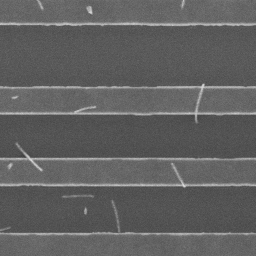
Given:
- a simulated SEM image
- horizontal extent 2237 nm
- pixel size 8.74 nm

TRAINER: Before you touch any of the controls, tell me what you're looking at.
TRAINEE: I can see lines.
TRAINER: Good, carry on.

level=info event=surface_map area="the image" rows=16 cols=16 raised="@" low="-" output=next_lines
@@@@@@@@@@@@@@@@
@@@@@@@@@@@@@@@@
----------------
----------------
----------------
@@@@@@@@@@@@@@@@
@@@@@@@@@@@@@@@@
----------------
----------------
----------------
@@@@@@@@@@@@@@@@
@@@@@@@@@@@@@@@@
----------------
----------------
----------------
@@@@@@@@@@@@@@@@